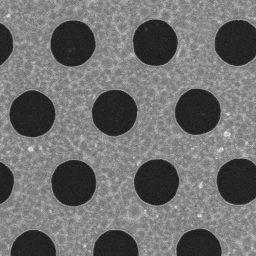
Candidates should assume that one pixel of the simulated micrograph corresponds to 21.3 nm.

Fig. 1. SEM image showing holes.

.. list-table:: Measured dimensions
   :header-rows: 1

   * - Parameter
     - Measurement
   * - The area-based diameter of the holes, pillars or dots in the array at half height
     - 973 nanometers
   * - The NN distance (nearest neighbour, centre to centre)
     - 1720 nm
